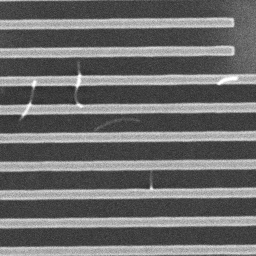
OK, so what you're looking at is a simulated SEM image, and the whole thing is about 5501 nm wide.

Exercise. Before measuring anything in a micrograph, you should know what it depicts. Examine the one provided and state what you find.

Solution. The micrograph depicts groups of lines, slits or small figures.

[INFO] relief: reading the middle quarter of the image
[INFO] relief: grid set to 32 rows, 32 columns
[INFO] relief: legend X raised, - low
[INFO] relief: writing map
--------------------------------
--------------------------------
--------------------------------
XXXXXXXXXXXXXXXXXXXXXXXXXXXXXXXX
XXXXXXXXXXXXXXXXXXXXXXXXXXXXXXXX
---X----------------------------
--------------------------------
--------------------------------
--------------------------------
--------------------------------
XXXXXXXXXXXXXXXXXXXXXXXXXXXXXXXX
XXXXXXXXXXXXXXXXXXXXXXXXXXXXXXXX
--------------------------------
--------------------------------
--------------------------------
--------------------------------
--------------------------------
XXXXXXXXXXXXXXXXXXXXXXXXXXXXXXXX
XXXXXXXXXXXXXXXXXXXXXXXXXXXXXXXX
XX------------------------------
--------------------------------
--------------------------------
--------------------------------
--------------------------------
-------XXXXXXXXXXXXXXXXXXXXXXXXX
XXXXXXXXXXXXXXXXXXXXXXXXXXXXXXXX
XXXXXXXXXXXXX-------------------
--------------------------------
--------------------------------
--------------------------------
--------------------------------
---------------XXXXXXXXXXXXXXXXX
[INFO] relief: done